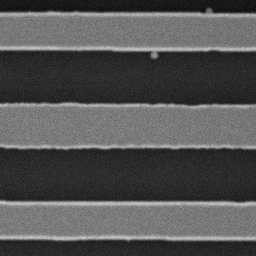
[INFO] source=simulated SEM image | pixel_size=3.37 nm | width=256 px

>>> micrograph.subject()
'lines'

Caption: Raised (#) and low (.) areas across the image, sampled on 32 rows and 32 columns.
................................
................................
################################
################################
################################
################################
................................
................................
................................
................................
................................
................................
................................
################################
################################
################################
################################
################################
..###.#####.##.#.....##....#.###
................................
................................
................................
................................
................................
................................
################################
################################
################################
################################
################################
................................
................................